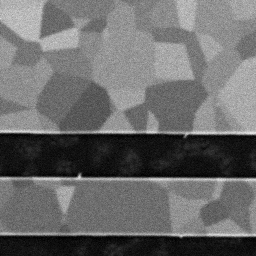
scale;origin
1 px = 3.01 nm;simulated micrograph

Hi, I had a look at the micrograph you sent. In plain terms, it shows one or a few lines or trenches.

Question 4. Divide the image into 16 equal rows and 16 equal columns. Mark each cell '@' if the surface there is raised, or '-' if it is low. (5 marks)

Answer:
@@@@@@@@@@@@@@@@
@@@@@@@@@@@@@@@@
@@@@@@@@@@@@@@@@
@@@@@@@@@@@@@@@@
@@@@@@@@@@@@@@@@
@@@@@@@@@@@@@@@@
@@@@@@@@@@@@@@@@
@@@@@@@@@@@@@@@@
----------------
----------------
----------------
@@@@@@@@@@@@@@@@
@@@@@@@@@@@@@@@@
@@@@@@@@@@@@@@@@
@@@@@@@@@@@@@@@@
----------------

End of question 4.